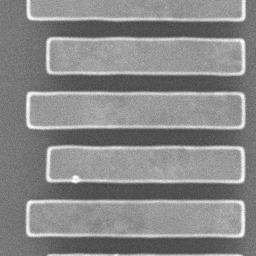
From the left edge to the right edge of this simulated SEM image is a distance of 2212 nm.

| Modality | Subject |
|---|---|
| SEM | groups of lines, slits or small figures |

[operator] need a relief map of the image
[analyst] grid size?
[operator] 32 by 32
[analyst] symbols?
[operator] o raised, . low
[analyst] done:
....ooooooooooooooooooooooooooo.
....ooooooooooooooooooooooooooo.
................................
................................
................................
......oooooooooooooooooooooooo..
......oooooooooooooooooooooooo..
......ooooooooooooooooooooooooo.
......ooooooooooooooooooooooooo.
................................
................................
................................
....oooooooooooooooooooooooooo..
....oooooooooooooooooooooooooo..
....ooooooooooooooooooooooooooo.
....oooooooooooooooooooooooooo..
................................
................................
......oooooooooooooooooooooooo..
......oooooooooooooooooooooooo..
......oooooooooooooooooooooooo..
......oooooooooooooooooooooooo..
......oooooooooooooooooooooooo..
................................
................................
....oooooooooooooooooooooooooo..
...ooooooooooooooooooooooooooo..
...ooooooooooooooooooooooooooo..
...ooooooooooooooooooooooooooo..
.................ooo............
................................
................................